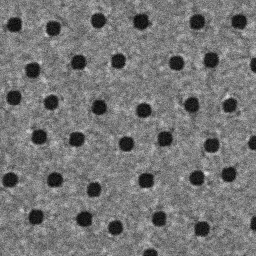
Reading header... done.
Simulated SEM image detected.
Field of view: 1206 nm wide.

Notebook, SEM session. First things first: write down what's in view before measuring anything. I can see a regular array of holes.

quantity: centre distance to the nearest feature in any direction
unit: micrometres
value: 0.179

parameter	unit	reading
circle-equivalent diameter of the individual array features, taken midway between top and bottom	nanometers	82.2